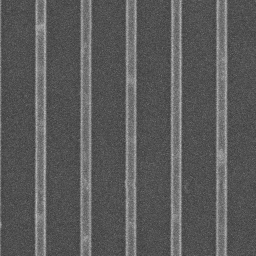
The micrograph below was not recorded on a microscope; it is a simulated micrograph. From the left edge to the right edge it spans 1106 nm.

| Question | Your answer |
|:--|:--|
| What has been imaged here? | parallel lines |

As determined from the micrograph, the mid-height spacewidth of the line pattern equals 153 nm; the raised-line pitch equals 195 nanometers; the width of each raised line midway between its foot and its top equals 41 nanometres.